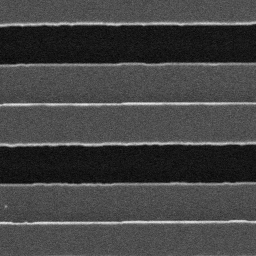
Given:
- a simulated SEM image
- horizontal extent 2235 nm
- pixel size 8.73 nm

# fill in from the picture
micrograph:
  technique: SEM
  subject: lines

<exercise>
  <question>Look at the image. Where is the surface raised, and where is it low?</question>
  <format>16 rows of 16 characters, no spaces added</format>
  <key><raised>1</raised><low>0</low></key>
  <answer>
1111111111111111
1111101111010000
0000000000000000
0000000000000000
1111111111111111
1111111111111111
1111111111111111
1111111111111111
1111111111111111
0000000000000000
0000000000000000
0000000000111111
1111111111111111
1111111111111111
1111111111111111
1111111111111111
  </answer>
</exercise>